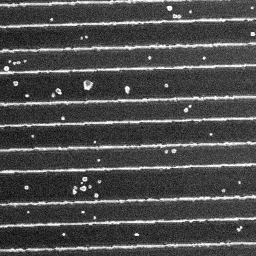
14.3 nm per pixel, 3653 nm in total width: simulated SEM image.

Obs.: lines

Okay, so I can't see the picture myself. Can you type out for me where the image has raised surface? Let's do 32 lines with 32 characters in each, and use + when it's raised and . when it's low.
..++++++++++++++++++++++++++++++
++++++++++++++++++++++++++++++++
++++++++++++++++++++++++++++....
................................
................................
...............................+
++++++++++++++++++++++++++++++++
++++++++++++++++++++++++++++++++
+++++++++++++++++++.............
................................
................................
................................
.................+++++++++++++++
++++++++++++++++++++++++++++++++
++++++++++++++++++++++++++++++++
+++++++.........................
................................
................................
........++++++++++++++++++++++++
++++++++++++++++++++++++++++++++
++++++++++++++++++++++++++++++++
++..............................
................................
................................
...............................+
.+++++++++++++++++++++++++++++++
++++++++++++++++++++++++++++++++
++++++++++++++++++++++++++......
................................
................................
...........................+++++
++++++++++++++++++++++++++++++++